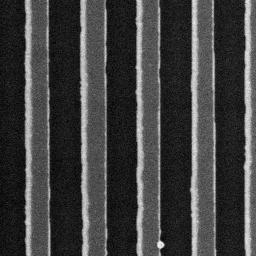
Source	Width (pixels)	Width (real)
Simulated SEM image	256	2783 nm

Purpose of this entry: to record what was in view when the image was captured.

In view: lines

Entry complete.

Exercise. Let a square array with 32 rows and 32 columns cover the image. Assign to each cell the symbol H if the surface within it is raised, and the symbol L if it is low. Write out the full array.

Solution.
LLLHHHLLLLHHHLLLLHHHLLLLHHHLLLLH
LLLHHHLLLLHHHLLLLHHHLLLLHHHLLLLH
LLLHHHLLLLHHHLLLLHHHLLLLHHHLLLLH
LLLHHHLLLLHHHLLLLHHHLLLLHHHLLLLH
LLLHHHLLLLHHHLLLLHHHLLLLHHHLLLLH
LLLHHHLLLLHHHLLLLHHHLLLLHHHLLLLH
LLLHHHLLLLHHHLLLLHHHLLLLHHHLLLLH
LLLHHHLLLLHHHLLLLHHHLLLLHHHLLLLH
LLLHHHLLLLHHHLLLLHHHLLLLHHHLLLLH
LLLHHHLLLLHHHLLLLHHHLLLLHHHLLLLH
LLLHHHLLLLHHHLLLLHHHLLLLHHHLLLLH
LLLHHHLLLLHHHLLLLHHHLLLLHHHLLLLH
LLLHHHLLLLHHHLLLLHHHLLLLHHHLLLLH
LLLHHHLLLLHHHLLLLHHHLLLLHHHLLLLH
LLLHHHLLLLHHHLLLLHHHLLLLHHHLLLLH
LLLHHHLLLLHHHLLLLHHHLLLLHHHLLLLH
LLLHHHLLLLHHHLLLLHHHLLLLHHHLLLLH
LLLHHHLLLLHHHLLLLHHHLLLLHHHLLLLH
LLLHHHLLLLHHHLLLLHHHLLLLHHHLLLLH
LLLHHHLLLLHHHLLLLHHHLLLLHHHLLLLH
LLLHHHLLLLHHHLLLLHHHLLLLHHHLLLLH
LLLHHHLLLLHHHLLLLHHHLLLLHHHLLLLH
LLLHHHLLLLHHHLLLLHHHLLLLHHHLLLLH
LLLHHHLLLLHHHLLLLHHHLLLLHHHLLLLH
LLLHHHLLLLHHHLLLLHHHLLLLHHHLLLLH
LLLHHHLLLLHHHLLLLHHHLLLLHHHLLLLH
LLLHHHLLLLHHHLLLLHHHLLLLHHHLLLLH
LLLHHHLLLLLHHLLLLHHHLLLLHHHLLLLH
LLLHHHLLLLLHHLLLLHHHLLLLHHHLLLLH
LLLHHHLLLLLHHLLLLHHHLLLLHHHLLLLH
LLLHHHLLLLLHHLLLLHHHLLLLHHHLLLLH
LLLHHHLLLLHHHLLLLHHHLLLLHHHLLLLH